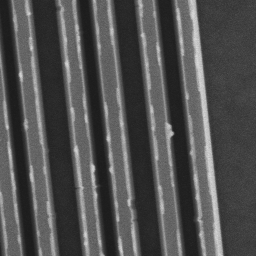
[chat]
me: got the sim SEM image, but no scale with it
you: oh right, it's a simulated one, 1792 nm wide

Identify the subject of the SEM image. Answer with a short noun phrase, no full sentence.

parallel lines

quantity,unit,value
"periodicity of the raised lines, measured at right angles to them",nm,284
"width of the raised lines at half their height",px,19.3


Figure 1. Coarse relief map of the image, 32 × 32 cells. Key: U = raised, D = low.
DUUUDDDUUUDUUUDDDUUUDDUUDDDDDDDD
DUUUDDDUUUDDUUDDDUUUDDUUDDDDDDDD
DDUUDDDUUUDDUUDDDUUUDDUUDDDDDDDD
DDUUDDDDUUDDUUDDDUUUDDUUUDDDDDDD
DDUUDDDDUUDDUUDDDDUUDDUUUDDDDDDD
DDUUDDDDUUDDUUDDDDUUDDUUUDDDDDDD
DDUUDDDDUUDDUUUDDDUUDDUUUDDDDDDD
DDUUDDDDUUDDUUUDDDUUDDDUUDDDDDDD
DDUUUDDDUUUDUUUDDDUUDDDUUDDDDDDD
UDUUUDDDUUUDUUUDDDUUUDDUUDDDDDDD
UDUUUDDDUUUDDUUDDDUUUDDUUDDDDDDD
UDUUUDDDUUUDDUUDDDUUUDDUUDDDDDDD
UDDUUDDDDUUDDUUDDDUUUDDUUDDDDDDD
UDDUUDDDDUUDDUUDDDDUUDDUUUDDDDDD
UDDUUDDDDUUDDUUDDDDUUDDUUUDDDDDD
UDDUUDDDDUUDDUUUDDDUUDDUUUDDDDDD
UDDUUDDDDUUDDUUUDDDUUUDDUUDDDDDD
UDDUUUDDDUUDDUUUDDDUUDDDUUDDDDDD
UUDUUUDDDUUUDUUUDDDUUUDDUUDDDDDD
UUDUUUDDDUUUDUUUDDDUUUDDUUDDDDDD
UUDUUUDDDUUUDDUUDDDUUUDDUUDDDDDD
UUDDUUDDDDUUDDUUDDDUUUDDUUDDDDDD
UUDDUUDDDDUUDDUUDDDDUUDDUUUDDDDD
UUDDUUDDDDUUDDUUDDDDUUDDUUUDDDDD
UUDDUUDDDDUUDDUUUDDDUUDDUUUDDDDD
UUDDUUDDDDUUDDUUUDDDUUDDUUUDDDDD
UUDDUUUDDDUUDDUUUDDDUUDDDUUDDDDD
UUUDUUUDDDUUUDUUUDDDUUDDDUUDDDDD
UUUDUUUDDDUUUDUUUDDDUUUDDUUDDDDD
UUUDUUUDDDUUUDDUUDDDUUUDDUUDDDDD
UUUDDUUDDDUUUDDUUDDDUUUDDUUDDDDD
UUUDDUUDDDDUUDDUUDDDDUUDDUUUDDDD